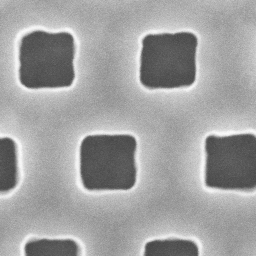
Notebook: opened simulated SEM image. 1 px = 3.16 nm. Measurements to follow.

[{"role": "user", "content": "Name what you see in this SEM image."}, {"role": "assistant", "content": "holes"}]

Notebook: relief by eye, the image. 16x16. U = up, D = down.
UUUUUUUUUUUUUUUU
UUUUUUUUUUUUUUUU
UDDDDUUUUDDDUUUU
UDDDDUUUUDDDUUUU
UDDDDUUUUDDDUUUU
UUDDUUUUUDDUUUUU
UUUUUUUUUUUUUUUU
UUUUUUUUUUUUUUUU
UUUUUUDDUUUUUDDD
DUUUUDDDDUUUUDDD
DUUUUDDDDUUUUDDD
DUUUUDDDUUUUUDDD
UUUUUUUUUUUUUUUU
UUUUUUUUUUUUUUUU
UUUUUUUUUUUUUUUU
UUDDDUUUUDDDUUUU